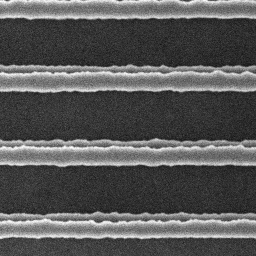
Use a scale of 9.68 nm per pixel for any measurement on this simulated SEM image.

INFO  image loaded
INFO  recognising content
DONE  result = lines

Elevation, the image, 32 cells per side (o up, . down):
oooooooooooooooooooooooooooooooo
oooooooooooooooooooooooooooooooo
................................
................................
................................
................................
................................
................................
oooooooooooooooooooooooooooooooo
oooooooooooooooooooooooooooooooo
oooooooooooooooooooooooooooooooo
................................
................................
................................
................................
................................
................................
...................o............
oooooooooooooooooooooooooooooooo
oooooooooooooooooooooooooooooooo
oooooooooooooooooooooooooooooooo
................................
................................
................................
................................
................................
................................
oooooooooooooooooooooooooooooooo
oooooooooooooooooooooooooooooooo
oooooooooooooooooooooooooooooooo
................................
................................